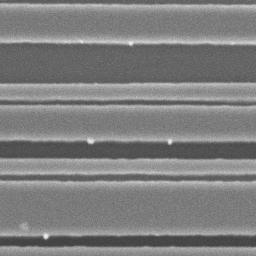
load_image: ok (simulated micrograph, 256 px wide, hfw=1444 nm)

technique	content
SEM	lines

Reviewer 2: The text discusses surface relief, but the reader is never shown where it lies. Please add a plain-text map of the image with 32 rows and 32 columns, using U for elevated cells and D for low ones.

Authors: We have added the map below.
UUUUUUUUUUUUUUUUUUUUUUUUUUUUUUUU
UUUUUUUUUUUUUUUUUUUUUUUUUUUUUUUU
UUUUUUUUUUUUUUUUUUUUUUUUUUUUUUUU
UUUUUUUUUUUUUUUUUUUUUUUUUUUUUUUU
UUUUUUUUUUUUUUUUUUUUUUUUUUUUUUUU
DDDDDDDDDDDDDDDDDDDDDDDDDDDDDDDD
DDDDDDDDDDDDDDDDDDDDDDDDDDDDDDDD
DDDDDDDDDDDDDDDDDDDDDDDDDDDDDDDD
DDDDDDDDDDDDDDDDDDDDDDDDDDDDDDDD
DDDDDDDDDDDDDDDDDDDDDDDDDDDDDDDD
DDDDDDDDDDDDDDDDUDUUUUUUUUUUUUUU
UUUUUUUUUUUUUUUUUUUUUUUUUUUUUUUU
UUUUUUUUUUUUUUUUUUUUUUUUUUUUUUUU
UUUUUUUUUUUUUUUUUUUUUUUUUUUUUUUU
UUUUUUUUUUUUUUUUUUUUUUUUUUUUUUUU
UUUUUUUUUUUUUUUUUUUUUUUUUUUUUUUU
UUUUUUUUUUUUUUUUUUUUUUUUUUUUUUUU
DDDDUUUUUUUUUDUUUUUUUUUUUUUUUUUU
DDDDDDDDDDDDDDDDDDDDDDDDDDDDDDDD
DDDDDDDDDDDDDDDDDDDDDDDDDDDDDDDD
UUUUUUUUUUUUUUUUUUUUUUUUUUUUUUUU
UUUUUUUUUUUUUUUUUUUUUUUUUUUUUUUU
UUUUUUUUUUUUUUUUUUUUUUUUUUUUUUUU
UUUUUUUUUUUUUUUUUUUUUUUUUUUUUUUU
UUUUUUUUUUUUUUUUUUUUUUUUUUUUUUUU
UUUUUUUUUUUUUUUUUUUUUUUUUUUUUUUU
UUUUUUUUUUUUUUUUUUUUUUUUUUUUUUUU
UUUUUUUUUUUUUUUUUUUUUUUUUUUUUUUU
UUUUUUUUUUUUUUUUUUUUUUUUUUUUUUUU
DDDDDUDDDDDDDDDDDDDDDDDDDDDDDDDD
DDDDDDDDDDDDDDDDDDDDDDDDDDDDDDDD
UUUUUUUUUUUUUUUUUUUUUUUUUUUUUUUU